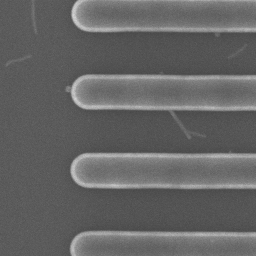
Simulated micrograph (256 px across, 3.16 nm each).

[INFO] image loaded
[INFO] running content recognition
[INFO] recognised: groups of lines, slits or small figures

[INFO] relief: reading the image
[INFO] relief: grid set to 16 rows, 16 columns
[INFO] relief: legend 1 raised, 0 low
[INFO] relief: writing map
0000011111111111
0000011111111111
0000000000000000
0000000000000000
0000000000000000
0000011111111111
0000011111111111
0000000000000000
0000000000000000
0000000000000000
0000011111111111
0000011111111111
0000000000000000
0000000000000000
0000000000000000
0000011111111111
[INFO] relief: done